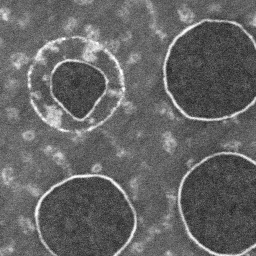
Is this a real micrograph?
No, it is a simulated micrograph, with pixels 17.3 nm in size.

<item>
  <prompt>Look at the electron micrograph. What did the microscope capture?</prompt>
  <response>raised bodies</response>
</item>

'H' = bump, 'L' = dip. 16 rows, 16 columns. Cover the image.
LLLLLLLLLLLLLLLL
LLLLLLLLLLLLHHHL
LLLLLLLLLLLHHHHH
LLLLLLLLLLHHHHHH
LLLHHHLLLLHHHHHH
LLLHHHHLLLHHHHHH
LLLLHHLLLLLHHHHH
LLLLLLLLLLLLLLLL
LLLLLLLLLLLLLLLL
LLLLLLLLLLLLLLLL
LLLLLLLLLLLLHHHH
LLLLHHHLLLLHHHHH
LLLHHHHHLLLHHHHH
LLHHHHHHLLLHHHHH
LLHHHHHHLLLLHHHH
LLLHHHHHLLLLLHHH